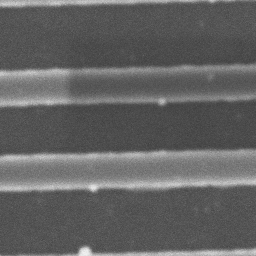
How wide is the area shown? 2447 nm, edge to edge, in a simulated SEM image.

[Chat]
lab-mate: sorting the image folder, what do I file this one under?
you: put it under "lines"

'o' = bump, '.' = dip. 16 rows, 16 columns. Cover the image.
................
................
................
................
.ooooooooooooooo
oooooooooooooooo
oo..............
................
................
..........oooooo
oooooooooooooooo
oooooooooooooooo
................
................
................
................